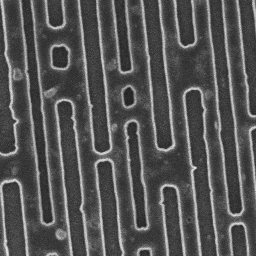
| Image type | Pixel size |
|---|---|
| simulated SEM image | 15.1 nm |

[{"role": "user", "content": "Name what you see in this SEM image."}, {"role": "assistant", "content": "parallel lines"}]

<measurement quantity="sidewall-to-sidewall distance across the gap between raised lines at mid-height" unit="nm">229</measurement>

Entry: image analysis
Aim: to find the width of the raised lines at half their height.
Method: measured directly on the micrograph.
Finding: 256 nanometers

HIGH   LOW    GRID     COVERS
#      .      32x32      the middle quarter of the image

.####.....####...####....#######
######....####...####....#######
######....###########....#######
######....############....######
######....############....######
######....############....######
######.....####..#####....######
######.....####...####....####..
######....#####...####....####..
..####.....####...####....####..
..#####....####..#####.....###..
..#####....###########.....###..
..#####....###########.....###..
..#####....###########.....####.
...####....#####.#####.....####.
..#####....#####...####....####.
...####....#####..#####....####.
...####....#####..#####....####.
...####....#####...####....####.
...####.....####...####....####.
...####.....####...####....####.
...#####...#####...############.
....############...#############
....############...#############
....#####...####...#############
....####....####....############
....####....####...#############
....####....####...#############
....####....#####...############
....####.....####...############
....####.....####...######.#####
....#####....####...####....####